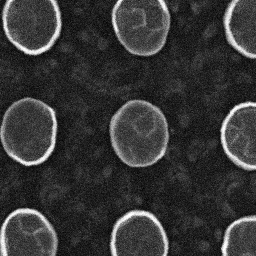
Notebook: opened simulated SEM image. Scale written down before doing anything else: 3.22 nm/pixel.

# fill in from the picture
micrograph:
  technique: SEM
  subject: raised bodies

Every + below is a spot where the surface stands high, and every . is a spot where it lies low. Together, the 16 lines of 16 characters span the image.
++++...+++....++
++++...++++...++
.++....+++....++
................
................
................
.++.....+......+
+++....+++....++
+++....+++....++
+++....+++....++
...............+
................
................
.++.....++......
+++....+++....++
+++....+++....++